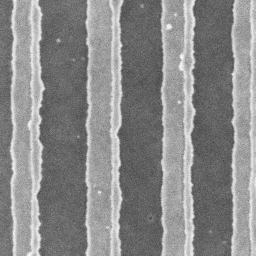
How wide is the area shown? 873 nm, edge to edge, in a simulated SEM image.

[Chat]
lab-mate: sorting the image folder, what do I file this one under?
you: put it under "lines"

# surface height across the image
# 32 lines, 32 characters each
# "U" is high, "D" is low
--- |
DDUUUDDDDDDUUUUDDDDDUUUUDDDDDUUU
DDUUUDDDDDDUUUUDDDDDUUUUDDDDDUUU
DDUUUDDDDDDUUUUDDDDDUUUUDDDDDUUU
DDUUUDDDDDDUUUUDDDDDUUUUDDDDDUUU
DDUUUDDDDDDUUUUDDDDDUUUUDDDDDUUU
DDUUUDDDDDDUUUUDDDDDUUUUDDDDDUUU
DDUUUDDDDDDUUUUDDDDDUUUUDDDDDUUU
DDUUUDDDDDDUUUUDDDDDUUUUDDDDDUUU
DDUUUDDDDDDUUUUDDDDDUUUUDDDDDUUU
DDUUUDDDDDDUUUUDDDDDUUUUDDDDDUUU
DDUUUDDDDDDUUUUDDDDDUUUUDDDDDUUU
DUUUUDDDDDDUUUUDDDDDUUUUDDDDDUUU
DUUUUDDDDDDUUUUDDDDDUUUUDDDDDUUU
DUUUUDDDDDDUUUUDDDDDUUUUDDDDDUUU
DDUUUDDDDDDUUUUDDDDDUUUUDDDDDUUU
DDUUUDDDDDDUUUUDDDDDUUUUDDDDDUUU
DDUUUDDDDDDUUUUDDDDDUUUUDDDDDUUU
DDUUUDDDDDDUUUUDDDDDUUUUDDDDDUUU
DUUUUDDDDDDUUUUDDDDDUUUUDDDDDUUU
DUUUUDDDDDDUUUUDDDDDUUUUDDDDDUUU
DDUUUDDDDDDUUUUDDDDDUUUUDDDDDUUU
DDUUUDDDDDDUUUUDDDDDUUUUDDDDDUUU
DUUUUDDDDDDUUUUDDDDDUUUUDDDDDUUU
DUUUUDDDDDDUUUUDDDDDUUUUDDDDDUUU
DUUUUDDDDDDUUUUDDDDDUUUUDDDDDUUU
DUUUUDDDDDDUUUUDDDDDUUUUDDDDDUUU
DDUUUDDDDDDUUUUDDDDDUUUUDDDDDUUU
DDUUUDDDDDDUUUUDDDDDUUUUDDDDDUUU
DDUUUDDDDDDUUUUDDDDDUUUUDDDDDUUU
DDUUUDDDDDDUUUUDDDDDUUUUDDDDDUUU
DDUUUDDDDDDUUUUDDDDDUUUUDDDDDUUU
DDUUUDDDDDDUUUUDDDDDUUUUDDDDDUUU